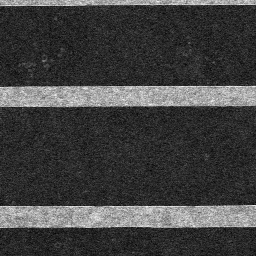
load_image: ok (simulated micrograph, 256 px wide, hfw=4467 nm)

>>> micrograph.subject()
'one or a few lines or trenches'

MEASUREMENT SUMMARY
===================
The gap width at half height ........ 1580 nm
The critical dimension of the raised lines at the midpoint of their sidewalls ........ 340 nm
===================